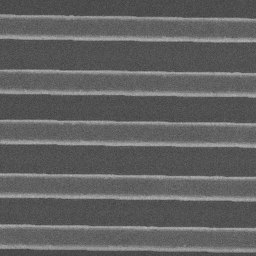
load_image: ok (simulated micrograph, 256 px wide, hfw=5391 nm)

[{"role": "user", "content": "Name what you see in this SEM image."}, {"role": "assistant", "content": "lines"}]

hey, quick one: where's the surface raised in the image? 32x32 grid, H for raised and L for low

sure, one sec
LLLLLLLLLLLLLLLLLLLLLLLLLLLLLLLL
LLLLLLLLLLLLLLLLLLLLLLLLLLLLLLLL
HHHHHHHHHHHHHHHHHHHHHHHHHHHHHHHH
HHHHHHHHHHHHHHHHHHHHHHHHHHHHHHHH
HHHHHHHHHHHHHHHHHHHHHHHHHHHHHHHH
LLLLLLLLLLLLLLLLLLLLLLLLLLLLLLLL
LLLLLLLLLLLLLLLLLLLLLLLLLLLLLLLL
LLLLLLLLLLLLLLLLLLLLLLLLLLLLLLLL
LLLLLLLLLLLLLLLLLLLLLLLLLLLLLLLL
HHHHHHHHHHHHHHHHHHHHHHHHHHHHHHHH
HHHHHHHHHHHHHHHHHHHHHHHHHHHHHHHH
HHHHHHHHHHHHHHHHHHHHHHHHHHHHHHHH
LLLLLLLLLLLLLLLLLLLLLLLLLLLLLLLL
LLLLLLLLLLLLLLLLLLLLLLLLLLLLLLLL
LLLLLLLLLLLLLLLLLLLLLLLLLLLLLLLL
HHHHHHHHHHHHHHHHHHHHHHHHHHHHHHHH
HHHHHHHHHHHHHHHHHHHHHHHHHHHHHHHH
HHHHHHHHHHHHHHHHHHHHHHHHHHHHHHHH
LLLLLLLLLLLLLLLLLLLLLLLLLLLLLLLL
LLLLLLLLLLLLLLLLLLLLLLLLLLLLLLLL
LLLLLLLLLLLLLLLLLLLLLLLLLLLLLLLL
LLLLLLLLLLLLLLLLLLLLLLLLLLLLLLLL
HHHHHHHHHHHHHHHHHHHHHHHHHHHHHHHH
HHHHHHHHHHHHHHHHHHHHHHHHHHHHHHHH
HHHHHHHHHHHHHHHHHHHHHHHHHHHHHHHH
LLLLLLLLLLLLLLLLLLLLLLLLLLLLLLLL
LLLLLLLLLLLLLLLLLLLLLLLLLLLLLLLL
LLLLLLLLLLLLLLLLLLLLLLLLLLLLLLLL
HHHHHHHHHHHHHHHHHHHHHHHHHHLLLLLL
HHHHHHHHHHHHHHHHHHHHHHHHHHHHHHHH
HHHHHHHHHHHHHHHHHHHHHHHHHHHHHHHH
LLLLLLLLLLLLLLLLLLLLLLLLLLLLLLLL